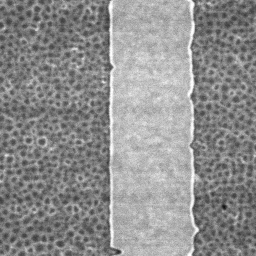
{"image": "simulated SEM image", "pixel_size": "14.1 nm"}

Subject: one or a few lines or trenches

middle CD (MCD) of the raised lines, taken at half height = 81.5 pixels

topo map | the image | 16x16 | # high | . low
.......#####....
.......#####....
.......#####....
.......#####....
.......#####....
.......#####....
.......#####....
.......#####....
.......#####....
.......#####....
.......#####....
.......#####....
.......#####....
.......#####....
.......#####....
.......#####....